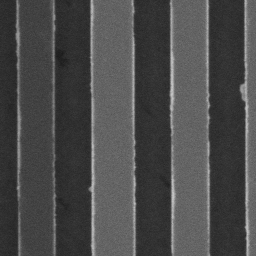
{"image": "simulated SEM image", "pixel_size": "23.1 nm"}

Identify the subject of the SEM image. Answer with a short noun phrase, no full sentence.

lines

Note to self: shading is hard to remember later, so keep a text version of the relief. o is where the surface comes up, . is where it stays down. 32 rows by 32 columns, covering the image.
..ooooo....oooooo....ooooo.....o
..ooooo....oooooo....ooooo.....o
..ooooo....oooooo....ooooo.....o
..ooooo....oooooo....ooooo.....o
..ooooo....oooooo....ooooo.....o
..ooooo....oooooo....ooooo.....o
..ooooo....oooooo....ooooo.....o
..ooooo....oooooo....ooooo.....o
..ooooo.....ooooo....ooooo.....o
..ooooo.....ooooo....ooooo.....o
..ooooo.....ooooo.....oooo.....o
..ooooo.....ooooo.....oooo.....o
..ooooo.....ooooo.....oooo.....o
..ooooo.....ooooo.....oooo.....o
..ooooo.....ooooo....ooooo.....o
..ooooo.....ooooo....ooooo.....o
..ooooo.....ooooo.....oooo.....o
..ooooo.....ooooo.....oooo.....o
..ooooo.....ooooo.....oooo.....o
..ooooo.....ooooo.....oooo.....o
..ooooo.....ooooo.....oooo.....o
..ooooo.....ooooo.....oooo.....o
..ooooo.....ooooo.....oooo.....o
..ooooo.....ooooo.....oooo.....o
..ooooo.....ooooo.....oooo.....o
..ooooo.....ooooo.....oooo.....o
..ooooo.....ooooo.....oooo.....o
..ooooo.....ooooo.....oooo.....o
..ooooo.....ooooo.....oooo.....o
..ooooo.....ooooo.....oooo.....o
..ooooo.....ooooo.....oooo.....o
..ooooo.....ooooo.....oooo.....o